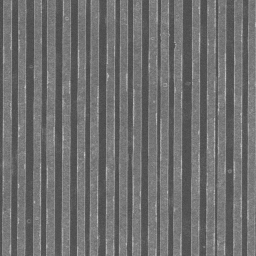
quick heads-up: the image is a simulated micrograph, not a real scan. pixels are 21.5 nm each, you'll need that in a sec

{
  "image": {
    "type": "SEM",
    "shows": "parallel lines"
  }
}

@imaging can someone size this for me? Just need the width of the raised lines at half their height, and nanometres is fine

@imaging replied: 166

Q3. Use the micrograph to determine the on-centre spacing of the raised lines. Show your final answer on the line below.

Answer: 14.4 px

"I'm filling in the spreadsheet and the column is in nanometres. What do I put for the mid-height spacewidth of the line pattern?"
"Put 153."